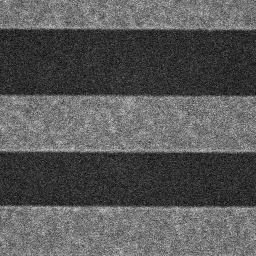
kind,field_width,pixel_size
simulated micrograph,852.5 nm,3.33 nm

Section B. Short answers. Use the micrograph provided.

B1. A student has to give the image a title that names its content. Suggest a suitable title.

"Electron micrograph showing one or a few lines or trenches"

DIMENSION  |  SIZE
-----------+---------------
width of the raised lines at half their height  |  0.178 micrometres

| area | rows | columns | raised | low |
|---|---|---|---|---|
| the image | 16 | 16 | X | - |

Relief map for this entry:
XXXXXXXXXXXXXXXX
XXXXXXXXXXXXXXXX
----------------
----------------
----------------
----------------
XXXXXXXXXXXXXXXX
XXXXXXXXXXXXXXXX
XXXXXXXXXXXXXXXX
----------------
----------------
----------------
----------------
XXXXXXXXXXXXXXXX
XXXXXXXXXXXXXXXX
XXXXXXXXXXXXXXXX